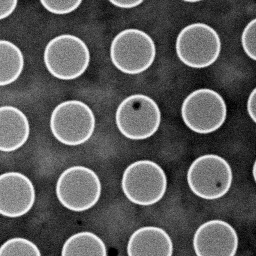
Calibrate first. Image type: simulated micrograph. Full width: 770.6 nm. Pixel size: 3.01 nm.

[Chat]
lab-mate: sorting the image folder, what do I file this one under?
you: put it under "an array of small figures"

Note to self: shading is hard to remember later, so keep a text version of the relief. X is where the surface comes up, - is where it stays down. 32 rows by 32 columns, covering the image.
XX---XXXXX----XXX---------------
X------X------------------------
--------------------------------
-----------------------XXX-----X
--------X------XXX----XXXXX---XX
X-----XXXX----XXXXX---XXXXX---XX
XX----XXXXX---XXXXX---XXXXX----X
XXX---XXXXX---XXXXX----XXXX-----
XXX---XXXXX----XXX--------------
XX-----XXX----------------------
--------------------------------
------------------------XXX-----
----------------XXX----XXXXX---X
XX-----XXXX----XXXXX---XXXXX---X
XXX----XXXXX---XXXXX---XXXXX---X
XXX---XXXXXX---XXXXX---XXXXX----
XXXX---XXXX----XXXX------X------
XXX----XXXX---------------------
XX------------------------------
--------------------------X-----
-----------------XX-----XXXX----
--------XXX-----XXXX----XXXXX---
XXXX---XXXXX---XXXXXX---XXXXX---
XXXX---XXXXXX--XXXXXX---XXXXX---
XXXX---XXXXX----XXXX-----XXX----
XXXX----XXXX-----X--------------
XXX-----------------------------
--------------------------------
------------------X------XXXX---
---------XXX-----XXXX---XXXXXX--
-XXX----XXXXX---XXXXX---XXXXXX--
XXXXX---XXXXX---XXXXX----XXXX---